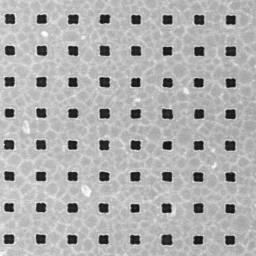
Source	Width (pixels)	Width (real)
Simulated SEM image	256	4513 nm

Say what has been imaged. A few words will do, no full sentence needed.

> a regular array of holes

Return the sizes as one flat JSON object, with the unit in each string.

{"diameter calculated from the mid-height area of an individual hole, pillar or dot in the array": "193 nm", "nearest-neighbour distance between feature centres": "550 nm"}